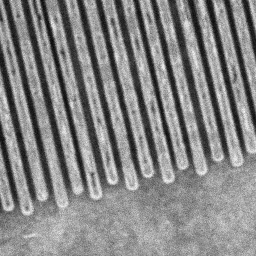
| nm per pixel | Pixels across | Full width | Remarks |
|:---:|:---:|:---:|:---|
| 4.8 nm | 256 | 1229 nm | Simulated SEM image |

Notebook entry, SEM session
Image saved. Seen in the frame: parallel lines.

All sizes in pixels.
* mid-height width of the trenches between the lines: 6.21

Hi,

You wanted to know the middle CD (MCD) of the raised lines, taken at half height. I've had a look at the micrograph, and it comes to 0.055 um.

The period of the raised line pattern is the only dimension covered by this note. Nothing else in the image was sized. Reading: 0.086 µm